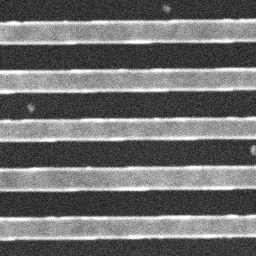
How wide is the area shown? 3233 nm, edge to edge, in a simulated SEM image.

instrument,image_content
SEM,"lines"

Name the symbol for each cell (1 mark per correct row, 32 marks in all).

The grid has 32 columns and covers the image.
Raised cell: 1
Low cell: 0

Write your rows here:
00000000000000000000000000000000
00000000000000000000000000000000
00000000000000000000000000001011
11111111111111111111111111111111
11111111111111111111111111111111
00000000000000000000000000000000
00000000000000000000000000000000
00000000000000000000000000000000
00000000000000000000000000000000
11111111111111111111111111111111
11111111111111111111111111111111
11000000000000000000000000000000
00000000000000000000000000000000
00000000000000000000000000000000
00000000000000000000000000000000
11111111111111111111111111111111
11111111111111111111111111111111
11111110000000000000000000000000
00000000000000000000000000000000
00000000000000000000000000000000
00000000000000000000000000000000
11111111111111111111111111111111
11111111111111111111111111111111
11111111111111111111111111111100
00000000000000000000000000000000
00000000000000000000000000000000
00000000000000000000000000000000
11111111111111111111111111111111
11111111111111111111111111111111
11111111111111111111111111111111
00000000000000000000000000000000
00000000000000000000000000000000